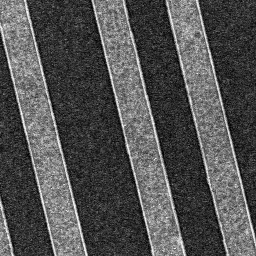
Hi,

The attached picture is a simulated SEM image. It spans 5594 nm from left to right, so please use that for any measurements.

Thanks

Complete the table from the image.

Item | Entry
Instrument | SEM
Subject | one or a few lines or trenches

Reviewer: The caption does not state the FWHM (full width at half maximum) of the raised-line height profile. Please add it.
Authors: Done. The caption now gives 648 nm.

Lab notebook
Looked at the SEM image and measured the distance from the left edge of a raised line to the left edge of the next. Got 1.82 microns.